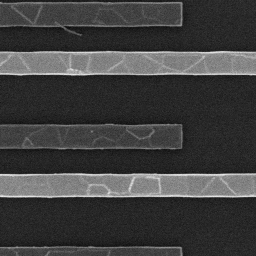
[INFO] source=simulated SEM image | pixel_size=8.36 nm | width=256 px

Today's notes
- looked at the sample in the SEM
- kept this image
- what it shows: wiring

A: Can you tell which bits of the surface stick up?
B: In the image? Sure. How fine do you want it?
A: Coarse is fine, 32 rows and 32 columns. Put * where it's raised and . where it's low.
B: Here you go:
**********************..........
***********************.........
***********************.........
................................
................................
................................
**..****....****....**.....**...
********************************
********************************
................................
................................
................................
................................
................................
................................
................................
***********************.........
***********************.........
*****.****************..........
................................
................................
................................
********************************
********************************
********************************
................................
................................
................................
................................
................................
................................
***********************.........